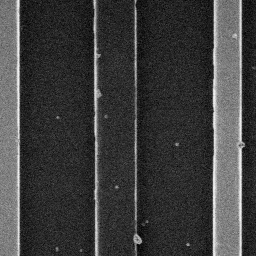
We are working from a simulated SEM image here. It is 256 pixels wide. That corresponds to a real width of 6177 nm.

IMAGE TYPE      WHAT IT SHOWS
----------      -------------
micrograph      lines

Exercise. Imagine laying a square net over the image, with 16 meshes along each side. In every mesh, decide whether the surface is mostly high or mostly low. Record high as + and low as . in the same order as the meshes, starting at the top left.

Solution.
+.....++.....++.
+.....++.....++.
+.....++.....++.
+.....++.....++.
+.....++.....++.
+.....++.....++.
+.....++.....++.
+.....++.....++.
+.....++.....++.
+.....++.....++.
+.....++.....++.
+.....++.....++.
+.....++.....++.
+.....++.....++.
+.....+++....++.
+.....+++....++.